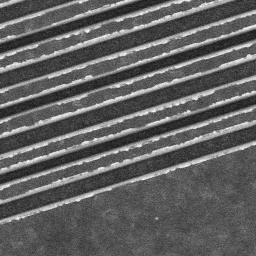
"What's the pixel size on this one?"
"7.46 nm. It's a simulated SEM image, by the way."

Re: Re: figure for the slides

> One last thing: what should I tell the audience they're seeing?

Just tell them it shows parallel lines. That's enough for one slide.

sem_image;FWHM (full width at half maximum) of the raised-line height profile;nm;126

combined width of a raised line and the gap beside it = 230 nanometres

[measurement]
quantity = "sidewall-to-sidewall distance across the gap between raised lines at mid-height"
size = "126 nm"